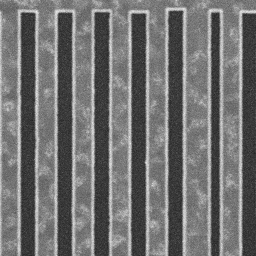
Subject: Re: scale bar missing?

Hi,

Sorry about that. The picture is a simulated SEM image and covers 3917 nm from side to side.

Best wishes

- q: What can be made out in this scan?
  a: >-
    parallel lines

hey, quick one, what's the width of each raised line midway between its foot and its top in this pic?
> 298 nm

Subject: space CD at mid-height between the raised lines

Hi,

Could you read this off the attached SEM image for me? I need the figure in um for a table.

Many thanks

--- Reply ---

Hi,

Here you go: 0.272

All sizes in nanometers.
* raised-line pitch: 565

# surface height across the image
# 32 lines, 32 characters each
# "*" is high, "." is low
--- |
********************************
***.***..***..***.***..***.****.
**...**..***..**...**..***..**..
**...**..***..**...**..***..**..
**...**..***..**...**..***..**..
**...**..***..**...**..***..**..
**...**..***..**...**..***..**..
**...**..***..**...**..***..**..
**...**..***..**...**..***..**..
**...**..***..**...**..***..**..
**...**..***..**...**..***..**..
**...**..***..**...**..***..**..
**...**..***..**...**..***..**..
**...**..***..**...**..***..**..
**...**..***..**...**..***..**..
**...**..**...**...**..***..**..
**...**..***..**...**..***..**..
**...**..***..**...**..***..**..
**...**..***..**...**..***..**..
**...**..***..**...**..***..**..
**...**..***..**..***..***..**..
**...**..***..**...**..***..**..
**...**..***..**...**..***..**..
**...**..***..**..***..***..**..
**...**..***..**..***..***..**..
**...**..***..**..***..***..**..
**...**..***..**..***..***..**..
**...**..***..**..***..***..**..
**...**..**...**..***..***..**..
**...**..***..**..***..***..**..
**...**..***..**..***..***..**..
**...**..***..**..***..***..**..